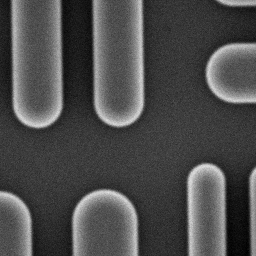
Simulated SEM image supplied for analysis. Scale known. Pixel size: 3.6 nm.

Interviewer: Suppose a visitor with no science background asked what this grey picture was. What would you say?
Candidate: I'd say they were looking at groups of lines, slits or small figures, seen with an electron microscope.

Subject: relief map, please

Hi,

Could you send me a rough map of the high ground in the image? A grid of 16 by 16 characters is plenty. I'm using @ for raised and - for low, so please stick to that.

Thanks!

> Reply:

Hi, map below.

-@@@--@@@-------
-@@@--@@@-------
-@@@--@@@-------
-@@@--@@@----@@@
-@@@--@@@----@@@
-@@@--@@@----@@@
-@@@--@@@-------
-@@----@--------
----------------
----------------
------------@---
------------@@--
@----@@@----@@--
@@---@@@----@@--
@@---@@@@---@@--
@@---@@@@---@@--